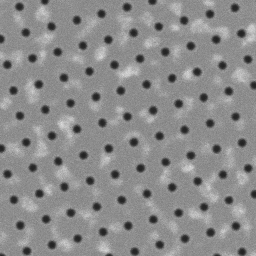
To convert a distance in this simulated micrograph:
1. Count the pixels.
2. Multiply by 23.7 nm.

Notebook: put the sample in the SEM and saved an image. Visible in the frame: a regular array of holes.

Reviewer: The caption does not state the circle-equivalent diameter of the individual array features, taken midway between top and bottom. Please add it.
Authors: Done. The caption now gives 222 nm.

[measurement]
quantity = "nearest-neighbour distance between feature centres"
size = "0.614 microns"